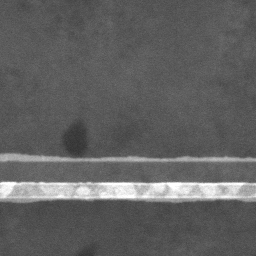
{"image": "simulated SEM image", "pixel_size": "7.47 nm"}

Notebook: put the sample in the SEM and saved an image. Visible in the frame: lines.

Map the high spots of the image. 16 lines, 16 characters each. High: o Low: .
................
................
................
................
................
................
................
................
................
................
oooooooooooooooo
oooooooooooooooo
................
................
................
................